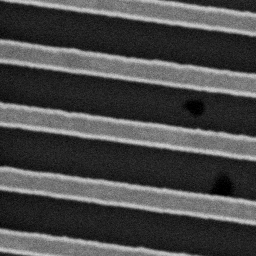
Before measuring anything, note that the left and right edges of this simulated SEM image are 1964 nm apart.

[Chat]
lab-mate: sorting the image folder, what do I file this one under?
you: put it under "lines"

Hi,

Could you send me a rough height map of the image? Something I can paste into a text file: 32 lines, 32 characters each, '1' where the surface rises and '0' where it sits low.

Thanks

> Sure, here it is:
00001111111111111111111000000000
00000000000111111111111111111100
00000000000000000011111111111111
00000000000000000000000001111111
00000000000000000000000000000000
11110000000000000000000000000000
11111111111000000000000000000000
11111111111111111100000000000000
00000011111111111111111111000000
00000000000001111111111111111111
00000000000000000000111111111111
00000000000000000000000000001111
00000000000000000000000000000000
11111000000000000000000000000000
11111111111100000000000000000000
11111111111111111111000000000000
00000001111111111111111111100000
00000000000000111111111111111111
00000000000000000000011111111111
00000000000000000000000000000111
00000000000000000000000000000000
11110000000000000000000000000000
11111111111100000000000000000000
11111111111111111110000000000000
00000011111111111111111111100000
00000000000001111111111111111111
00000000000000000000011111111111
00000000000000000000000000000111
00000000000000000000000000000000
11111100000000000000000000000000
11111111111110000000000000000000
01111111111111111111000000000000